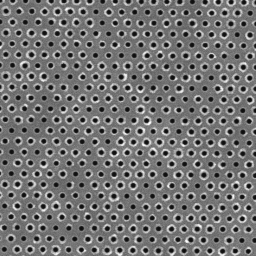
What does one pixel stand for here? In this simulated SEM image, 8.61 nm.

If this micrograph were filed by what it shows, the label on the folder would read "a regular array of holes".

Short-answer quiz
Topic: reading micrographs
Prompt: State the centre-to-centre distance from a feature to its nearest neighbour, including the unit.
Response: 106 nm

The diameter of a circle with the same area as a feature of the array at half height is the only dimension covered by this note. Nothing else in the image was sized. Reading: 43.5 nm